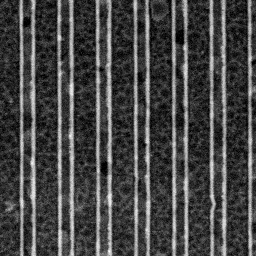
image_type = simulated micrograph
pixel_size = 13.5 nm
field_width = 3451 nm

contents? parallel lines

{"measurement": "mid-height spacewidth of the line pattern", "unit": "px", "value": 25.9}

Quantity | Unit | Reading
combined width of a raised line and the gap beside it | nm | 513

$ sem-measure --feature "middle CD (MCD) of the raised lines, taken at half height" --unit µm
0.169